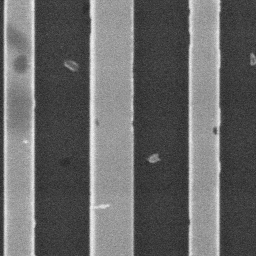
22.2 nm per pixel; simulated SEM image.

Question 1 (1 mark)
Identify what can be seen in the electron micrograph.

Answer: lines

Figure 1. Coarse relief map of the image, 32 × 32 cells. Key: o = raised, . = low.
.ooo.......oooooo.......ooo.....
.ooo.......oooooo.......ooo.....
.ooo.......oooooo.......ooo.....
.ooo.......oooooo.......ooo.....
.ooo.......oooooo.......ooo.....
.ooo.......oooooo.......ooo.....
.ooo.......oooooo.......ooo.....
.ooo.......oooooo.......ooo.....
.ooo.......oooooo.......ooo.....
.ooo.......oooooo.......ooo.....
.ooo.......oooooo.......ooo.....
.ooo.......oooooo.......ooo.....
.ooo.......oooooo.......ooo.....
.ooo.......oooooo.......ooo.....
.ooo.......oooooo.......ooo.....
.ooo.......oooooo.......ooo.....
.ooo.......oooooo.......ooo.....
.ooo.......oooooo.......ooo.....
.ooo.......oooooo.......ooo.....
.ooo.......oooooo.......ooo.....
.ooo.......oooooo.......ooo.....
.ooo.......oooooo.......ooo.....
.ooo.......oooooo.......ooo.....
.ooo.......oooooo.......ooo.....
.ooo.......oooooo.......ooo.....
.ooo.......oooooo.......ooo.....
.ooo.......oooooo.......ooo.....
.ooo.......oooooo.......ooo.....
.ooo.......oooooo.......ooo.....
.ooo.......oooooo.......ooo.....
.ooo.......oooooo.......ooo.....
.ooo.......oooooo.......ooo.....